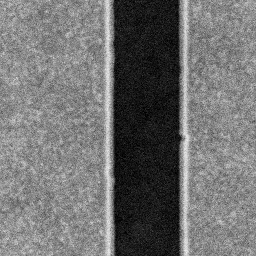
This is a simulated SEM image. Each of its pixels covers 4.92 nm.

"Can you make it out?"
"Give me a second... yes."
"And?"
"one or a few lines or trenches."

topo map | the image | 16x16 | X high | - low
XXXXXXX-----XXXX
XXXXXXX-----XXXX
XXXXXXX-----XXXX
XXXXXXX-----XXXX
XXXXXXX-----XXXX
XXXXXXX-----XXXX
XXXXXXX-----XXXX
XXXXXXX-----XXXX
XXXXXXX-----XXXX
XXXXXXX-----XXXX
XXXXXXX-----XXXX
XXXXXXX-----XXXX
XXXXXXX-----XXXX
XXXXXXX-----XXXX
XXXXXXX-----XXXX
XXXXXXX-----XXXX